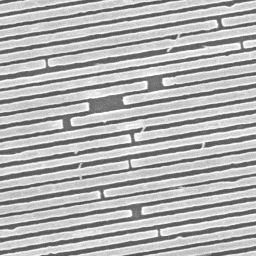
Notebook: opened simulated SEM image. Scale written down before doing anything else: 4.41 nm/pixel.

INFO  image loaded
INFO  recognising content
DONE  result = parallel lines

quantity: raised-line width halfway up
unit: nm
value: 34.2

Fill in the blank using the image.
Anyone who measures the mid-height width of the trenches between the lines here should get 21.2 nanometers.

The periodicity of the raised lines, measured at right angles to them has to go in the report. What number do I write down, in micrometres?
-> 0.0544